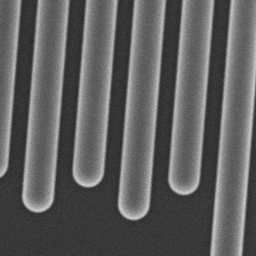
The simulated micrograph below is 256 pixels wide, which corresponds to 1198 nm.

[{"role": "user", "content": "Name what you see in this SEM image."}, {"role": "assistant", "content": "groups of lines, slits or small figures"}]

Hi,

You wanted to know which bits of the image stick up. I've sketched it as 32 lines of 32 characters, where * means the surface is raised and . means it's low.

***..****..****..****..****..***
**...***...****..****..****..***
**...***...***...***...****..***
**...***...***...***...***...***
**..****...***...***...***...***
**..****..****..****...***..****
**..****..****..****..****..****
**..****..****..****..****..****
**..****..****..****..****..****
**..****..****..****..****..****
**..****..****..****..****..****
**..****..****..****..****..****
**..****..****..****..****..****
*...****..***...****..****..****
*...***...***...***...***...****
*...***...***...***...***...***.
*...***..****...***...***...***.
*..****..****...***..****...***.
*..****..****..****..****..****.
*..****..****..****..****..****.
*..****..****..****..****..****.
*..****..****..****..****..****.
...****...***..****..****..****.
...****........****...**...****.
...****........****........****.
...***.........****........****.
...............***.........****.
...........................****.
...........................***..
...........................***..
...........................***..
..........................****..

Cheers